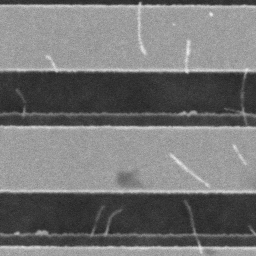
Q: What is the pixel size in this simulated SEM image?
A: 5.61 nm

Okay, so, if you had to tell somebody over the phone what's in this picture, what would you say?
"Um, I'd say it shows lines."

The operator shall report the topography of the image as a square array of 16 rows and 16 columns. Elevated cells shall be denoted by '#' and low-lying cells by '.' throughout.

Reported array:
################
################
################
################
................
................
................
................
################
################
################
################
................
................
................
################